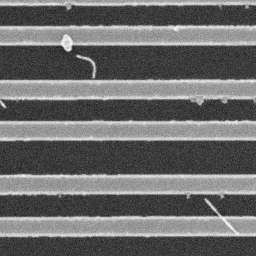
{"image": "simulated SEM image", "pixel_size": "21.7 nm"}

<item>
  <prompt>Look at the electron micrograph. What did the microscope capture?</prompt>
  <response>lines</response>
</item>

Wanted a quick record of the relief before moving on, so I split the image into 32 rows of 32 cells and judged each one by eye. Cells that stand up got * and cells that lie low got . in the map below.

...**...*.*****............*..**
................................
................................
********************************
********************************
.......**.......................
................................
................................
................................
................................
********************************
********************************
........................*.......
................................
................................
********************************
********************************
................................
................................
................................
................................
................................
********************************
********************************
................................
................................
................................
********************************
********************************
................................
................................
................................